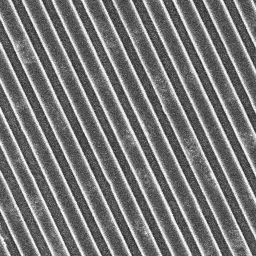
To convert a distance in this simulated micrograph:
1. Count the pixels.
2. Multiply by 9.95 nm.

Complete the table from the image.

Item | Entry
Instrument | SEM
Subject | parallel lines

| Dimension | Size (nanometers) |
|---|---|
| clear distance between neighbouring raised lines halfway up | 103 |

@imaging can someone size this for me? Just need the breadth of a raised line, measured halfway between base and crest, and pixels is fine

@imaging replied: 17.1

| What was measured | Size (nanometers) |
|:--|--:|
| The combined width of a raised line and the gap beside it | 272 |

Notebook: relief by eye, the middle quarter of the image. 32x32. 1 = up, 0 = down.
11000111100011111000111100011111
11000111110001111000111110001111
11100011110001111100011110001111
11100011111000111100011111000111
11110001111000111110001111000111
11110001111100011110001111100011
11111000111100011111000111100011
01111000111110001111000111110001
01111100011110001111100011110001
00111100011111000111100011111000
00111110001111000111110001111000
00011110001111000111110001111100
00011111000111100011111001111100
00011111000111100011111000111110
10001111100111110001111100111110
10001111100011110001111100011111
11000111110011111000111100011111
11000111110001111000111110001111
11100011110001111100011110001111
11100011111000111100011111000111
11110001111000111110001111000111
11110001111100011110001111100011
11111000111100011111000111100011
01111000111110001111000111110001
01111100011110001111100011110001
00111100011111000111100011111000
00111110001111000111110001111000
00111110001111100011110001111100
00011111000111100011111001111100
00011111000111110001111000111110
10001111100011110001111000111110
10001111100011111000111100011111